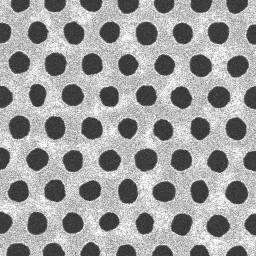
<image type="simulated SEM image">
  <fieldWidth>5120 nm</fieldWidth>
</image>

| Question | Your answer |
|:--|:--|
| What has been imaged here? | a regular array of holes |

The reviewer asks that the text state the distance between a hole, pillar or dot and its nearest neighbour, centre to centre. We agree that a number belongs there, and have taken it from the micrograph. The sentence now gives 35.6 px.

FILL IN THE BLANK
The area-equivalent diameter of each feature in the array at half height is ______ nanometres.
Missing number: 439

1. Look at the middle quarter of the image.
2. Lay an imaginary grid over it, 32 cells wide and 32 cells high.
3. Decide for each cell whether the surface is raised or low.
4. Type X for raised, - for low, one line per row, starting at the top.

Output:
-XXX------XXX------XXXX-----XXX-
XXXXX-----XXXX----XXXXX-----XXXX
XXXXX---XXXXXXX--XXXXXXX---XXXXX
XXXXXXXXXXXXXXXXXXXXXXXXXXXXXXXX
XXXXXXXXXXXXXXXXXXXXXXXXXXXXXXXX
----XXXXXXX-XXXXXXX---XXXXXXX-XX
----XXXXX-----XXXX-----XXXX----X
-----XXXX-----XXXX-----XXXX-----
-----XXXX-----XXXX-----XXXX-----
-----XXXX-----XXXX-----XXXX-----
XX-XXXXXXX---XXXXXXX--XXXXXX---X
XXXXXXXXXXXXXXXXXXXXXXXXXXXXXXXX
XXXXXXXXXXXXXXXXXXXXXXXXXXXXXXXX
XXXXX---XXXXXXXXXXXXXXXXXXXXXXXX
XXXXX----XXXXX----XXXXX---XXXXXX
XXXX------XXX------XXX-----XXXXX
XXXX------XXX-----XXXX-----XXXXX
XXXX------XXXX----XXXX-----XXXXX
XXXXXX---XXXXXX--XXXXXX----XXXXX
XXXXXXXXXXXXXXXXXXXXXXXXXXXXXXXX
XXXXXXXXXXXXXXXXXXXXXXXXXXXXXXXX
XX-XXXXXXXX-XXXXXXX---XXXXXX---X
-----XXXX----XXXXX-----XXXX-----
-----XXXX-----XXXX------XXX-----
-----XXXX-----XXXX-----XXX------
-----XXXX-----XXXX-----XXXX-----
X---XXXXXX---XXXXXX---XXXXXX--XX
XXXXXXXXXXXXXXXXXXXXXXXXXXXXXXXX
XXXXXXXXXXXXXXXXXXXXXXXXXXXXXXXX
XXXXX----XXXXX----XXXXXXX-XXXXXX
XXXX-----XXXXX----XXXXX-----XXXX
XXXX-----XXXX-----XXXX------XXX-